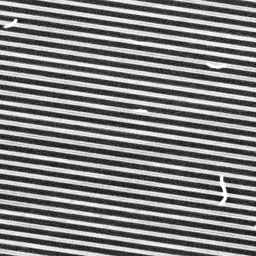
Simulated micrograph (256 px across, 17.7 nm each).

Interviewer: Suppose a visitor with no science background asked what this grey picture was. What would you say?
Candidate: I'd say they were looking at parallel lines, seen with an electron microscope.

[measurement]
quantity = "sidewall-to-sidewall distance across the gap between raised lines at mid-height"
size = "114 nanometers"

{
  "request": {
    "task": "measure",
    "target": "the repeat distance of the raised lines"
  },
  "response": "174 nm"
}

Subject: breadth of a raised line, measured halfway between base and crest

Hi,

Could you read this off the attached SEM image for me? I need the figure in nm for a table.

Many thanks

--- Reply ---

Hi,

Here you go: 48.3